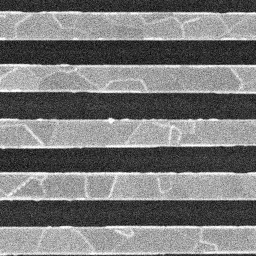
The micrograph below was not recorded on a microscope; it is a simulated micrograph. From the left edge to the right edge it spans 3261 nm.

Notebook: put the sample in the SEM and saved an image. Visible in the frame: lines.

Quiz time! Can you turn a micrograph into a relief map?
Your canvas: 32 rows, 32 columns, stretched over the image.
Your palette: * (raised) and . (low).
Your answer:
................................
................................
********************************
********************************
********************************
................................
................................
................................
********************************
********************************
********************************
............********************
................................
................................
................................
********************************
********************************
********************************
................................
................................
................................
................................
********************************
********************************
********************************
................................
................................
................................
********************************
********************************
********************************
********************************